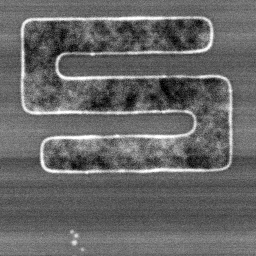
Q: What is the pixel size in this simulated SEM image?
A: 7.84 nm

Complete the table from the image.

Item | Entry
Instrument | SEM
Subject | groups of lines, slits or small figures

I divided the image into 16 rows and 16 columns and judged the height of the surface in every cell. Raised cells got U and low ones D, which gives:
DDDDDDDDDDDDDDDD
DDUUUUUUUUUUUDDD
DUUUUUUUUUUUUDDD
DUUUDDDDDDDDDDDD
DUUUDDDDDDDDDDDD
DUUUUUUUUUUUUUDD
DUUUUUUUUUUUUUDD
DDDDDDDDDDDDUUDD
DDDDDDDDDDDUUUDD
DDDUUUUUUUUUUUDD
DDDUUUUUUUUUUUDD
DDDDDDDDDDDDDDDD
DDDDDDDDDDDDDDDD
DDDDDDDDDDDDDDDD
DDDDDDDDDDDDDDDD
DDDDDDDDDDDDDDDD